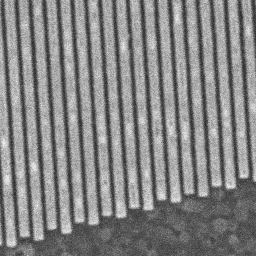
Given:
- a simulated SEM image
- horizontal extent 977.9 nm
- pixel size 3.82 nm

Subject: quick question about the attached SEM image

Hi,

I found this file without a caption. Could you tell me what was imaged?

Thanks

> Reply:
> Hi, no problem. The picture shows parallel lines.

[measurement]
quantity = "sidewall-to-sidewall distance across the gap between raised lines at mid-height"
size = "4.87 px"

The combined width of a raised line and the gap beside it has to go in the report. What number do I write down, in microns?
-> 0.0532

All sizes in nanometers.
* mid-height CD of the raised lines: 32.9